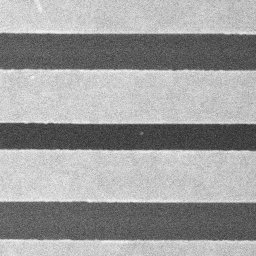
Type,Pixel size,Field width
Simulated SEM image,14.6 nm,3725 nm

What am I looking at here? lines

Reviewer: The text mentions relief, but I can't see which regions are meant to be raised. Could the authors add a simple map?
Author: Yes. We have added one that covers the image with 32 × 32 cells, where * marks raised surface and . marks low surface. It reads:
********************************
********************************
********************************
********************************
................................
................................
................................
................................
................................
********************************
********************************
********************************
********************************
********************************
********************************
...........................*...*
................................
................................
................................
********************************
********************************
********************************
********************************
********************************
********************************
................................
................................
................................
................................
................................
********************************
********************************